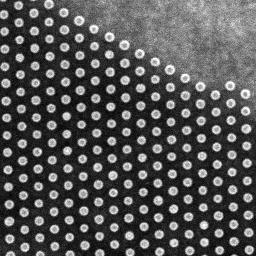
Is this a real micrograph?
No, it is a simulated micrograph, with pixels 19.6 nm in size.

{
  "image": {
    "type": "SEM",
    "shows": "a regular array of raised bodies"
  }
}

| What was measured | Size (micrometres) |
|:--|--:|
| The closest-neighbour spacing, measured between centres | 0.332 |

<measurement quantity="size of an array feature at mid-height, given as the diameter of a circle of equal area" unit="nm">164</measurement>